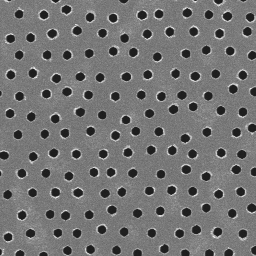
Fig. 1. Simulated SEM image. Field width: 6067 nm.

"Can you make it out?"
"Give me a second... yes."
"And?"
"a regular array of holes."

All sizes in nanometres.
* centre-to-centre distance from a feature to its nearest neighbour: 466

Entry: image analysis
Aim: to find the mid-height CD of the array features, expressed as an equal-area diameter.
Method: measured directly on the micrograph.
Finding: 214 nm